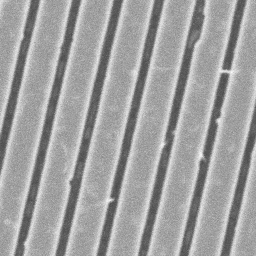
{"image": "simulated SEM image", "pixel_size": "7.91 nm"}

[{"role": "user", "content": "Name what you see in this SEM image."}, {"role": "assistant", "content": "parallel lines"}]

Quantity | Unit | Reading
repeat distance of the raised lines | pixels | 40.4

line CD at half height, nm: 237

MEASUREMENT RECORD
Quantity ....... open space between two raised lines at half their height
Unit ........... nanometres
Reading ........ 81